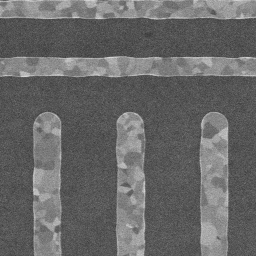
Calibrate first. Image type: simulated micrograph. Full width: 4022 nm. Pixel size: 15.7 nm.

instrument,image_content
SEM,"groups of lines, slits or small figures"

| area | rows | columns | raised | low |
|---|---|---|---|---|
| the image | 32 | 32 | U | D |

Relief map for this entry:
UUUUUUUUUUUUUUUUUUUUUUUUUUUUUUUU
UUUUUUUUUUUUUUUUUUUUUUUUUUUUUUUU
DDDDDDDDDDDDDDDDDDDDDDDDDDDDDDDD
DDDDDDDDDDDDDDDDDDDDDDDDDDDDDDDD
DDDDDDDDDDDDDDDDDDDDDDDDDDDDDDDD
DDDDDDDDDDDDDDDDDDDDDDDDDDDDDDDD
DDDDDDDDDDDDDDDDDDDDDDDDDDDDDDDD
UUUUUUUUUUUUUUUUUUUUUUUUUUUUUUUU
UUUUUUUUUUUUUUUUUUUUUUUUUUUUUUUU
DDUUDDDDDUUDDUUUDDDDDDDDDDDDDDDD
DDDDDDDDDDDDDDDDDDDDDDDDDDDDDDDD
DDDDDDDDDDDDDDDDDDDDDDDDDDDDDDDD
DDDDDDDDDDDDDDDDDDDDDDDDDDDDDDDD
DDDDDDDDDDDDDDDDDDDDDDDDDDDDDDDD
DDDDDUUDDDDDDDDUUDDDDDDDDDUUDDDD
DDDDUUUUDDDDDDDUUUDDDDDDDUUUDDDD
DDDDUUUUDDDDDDDUUUDDDDDDDUUUDDDD
DDDDUUUUDDDDDDDUUUDDDDDDDUUUDDDD
DDDDUUUUDDDDDDDUUUDDDDDDDUUUDDDD
DDDDUUUUDDDDDDDUUUDDDDDDDUUUDDDD
DDDDUUUUDDDDDDDUUUDDDDDDDUUUDDDD
DDDDUUUDDDDDDDDUUUDDDDDDDUUUDDDD
DDDDUUUDDDDDDDDUUUDDDDDDDUUUDDDD
DDDDUUUDDDDDDDDUUUDDDDDDDUUUDDDD
DDDDUUUDDDDDDDDUUUDDDDDDDUUUDDDD
DDDDUUUUDDDDDDDUUUDDDDDDDUUUDDDD
DDDDUUUUDDDDDDDUUUDDDDDDDUUUDDDD
DDDDUUUUDDDDDDDUUUDDDDDDDUUUDDDD
DDDDUUUUDDDDDDDUUUDDDDDDDUUUDDDD
DDDDUUUUDDDDDDDUUUDDDDDDDUUUDDDD
DDDDUUUUDDDDDDDUUUDDDDDDDUUUDDDD
DDDDUUUUDDDDDDDUUUDDDDDDDUUUDDDD